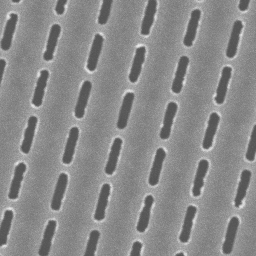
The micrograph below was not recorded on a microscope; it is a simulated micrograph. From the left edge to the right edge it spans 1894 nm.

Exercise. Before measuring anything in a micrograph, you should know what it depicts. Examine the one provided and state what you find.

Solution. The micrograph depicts a regular array of holes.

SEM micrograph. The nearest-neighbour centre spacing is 324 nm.